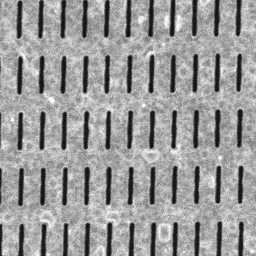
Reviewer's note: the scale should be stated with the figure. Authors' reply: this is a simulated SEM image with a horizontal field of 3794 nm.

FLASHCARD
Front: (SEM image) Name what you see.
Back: a regular array of holes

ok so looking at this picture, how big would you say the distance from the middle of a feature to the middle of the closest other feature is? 324 nm